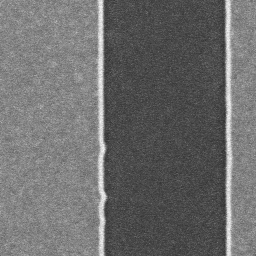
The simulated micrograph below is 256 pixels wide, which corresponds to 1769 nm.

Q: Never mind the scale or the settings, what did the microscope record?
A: one or a few lines or trenches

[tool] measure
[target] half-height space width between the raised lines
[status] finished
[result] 875 nanometres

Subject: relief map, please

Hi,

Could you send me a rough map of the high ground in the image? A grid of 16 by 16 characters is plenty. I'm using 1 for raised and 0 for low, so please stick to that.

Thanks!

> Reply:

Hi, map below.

1111110000000011
1111110000000011
1111110000000011
1111110000000011
1111110000000011
1111110000000011
1111110000000011
1111110000000011
1111110000000011
1111110000000011
1111110000000011
1111110000000011
1111110000000011
1111110000000011
1111110000000011
1111110000000011